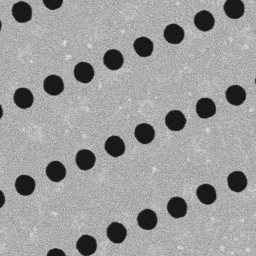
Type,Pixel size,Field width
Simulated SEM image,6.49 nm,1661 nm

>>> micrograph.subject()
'a regular array of holes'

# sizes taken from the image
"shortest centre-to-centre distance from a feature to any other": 212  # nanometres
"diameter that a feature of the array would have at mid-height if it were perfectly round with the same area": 134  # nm